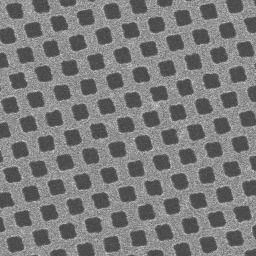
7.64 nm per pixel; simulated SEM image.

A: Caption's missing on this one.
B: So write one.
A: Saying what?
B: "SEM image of a regular array of holes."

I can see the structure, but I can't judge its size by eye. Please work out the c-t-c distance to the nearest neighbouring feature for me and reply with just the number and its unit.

198 nanometers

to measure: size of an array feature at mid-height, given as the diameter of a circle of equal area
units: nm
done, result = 126